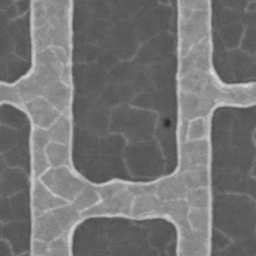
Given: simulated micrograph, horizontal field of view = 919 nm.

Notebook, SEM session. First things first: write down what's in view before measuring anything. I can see one or a few lines or trenches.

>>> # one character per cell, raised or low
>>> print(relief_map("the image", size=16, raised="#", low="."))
..##.......##...
..##.......##...
..##.......##...
..##.......##...
..##.......##...
####.......#####
.###.......#####
..##.......##...
..##.......##...
..##.......##...
..###......##...
..####.######...
..###########...
..####..#####...
..###......##...
..##.......##...